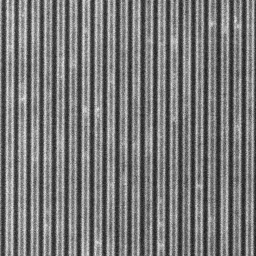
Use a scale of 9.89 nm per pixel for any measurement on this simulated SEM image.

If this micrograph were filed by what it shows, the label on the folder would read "parallel lines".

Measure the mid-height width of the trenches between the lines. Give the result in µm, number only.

0.047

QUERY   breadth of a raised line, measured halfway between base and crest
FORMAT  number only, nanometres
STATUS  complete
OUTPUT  75.4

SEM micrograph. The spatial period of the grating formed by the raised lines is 125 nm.